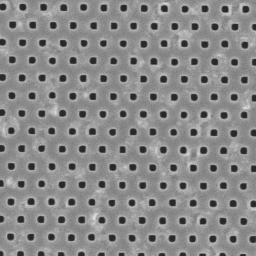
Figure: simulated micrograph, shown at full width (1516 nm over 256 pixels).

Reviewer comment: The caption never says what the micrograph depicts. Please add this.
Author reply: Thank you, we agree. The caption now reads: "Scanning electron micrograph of a regular array of holes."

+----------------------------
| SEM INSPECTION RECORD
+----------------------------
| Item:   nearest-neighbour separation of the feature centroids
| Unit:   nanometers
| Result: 117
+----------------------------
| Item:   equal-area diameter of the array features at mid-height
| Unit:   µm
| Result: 0.0422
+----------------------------